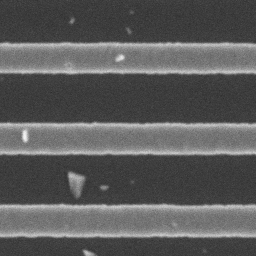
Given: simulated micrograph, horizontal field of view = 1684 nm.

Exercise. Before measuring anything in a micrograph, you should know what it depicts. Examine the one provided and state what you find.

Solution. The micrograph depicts lines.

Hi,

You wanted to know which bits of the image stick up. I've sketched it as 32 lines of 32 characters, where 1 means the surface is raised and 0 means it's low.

00000000000000000000000000000000
00000000000000000000000000000000
00000000000000000000000000000000
00000000000000000000000000000000
00000000000000000000000000000000
10000001101011100001111000011000
11111111111111111111111111111111
11111111111111111111111111111111
11111111111111111111111111111111
00000000000000000000000000000000
00000000000000000000000000000000
00000000000000000000000000000000
00000000000000000000000000000000
00000000000000000000000000000000
00000000000000000000000000000000
01000000000110000000100000000000
11111111111111111111111111111111
11111111111111111111111111111111
11111111111111111111111111111111
00000000000000000000000000000000
00000000000000000000000000000000
00000000000000000000000000000000
00000000010000000000000000000000
00000000010000000000000000000000
00000000000000000000000000000000
00000000000000000000000000000000
11111111111111111111111111111111
11111111111111111111111111111111
11111111111111111111111111111111
11111011111111111111111111111111
00000000000000000000000000000000
00000000000000000000000000000000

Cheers